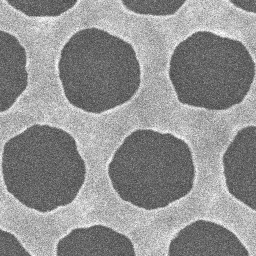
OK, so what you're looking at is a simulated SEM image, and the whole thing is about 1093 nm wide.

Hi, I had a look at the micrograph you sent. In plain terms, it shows holes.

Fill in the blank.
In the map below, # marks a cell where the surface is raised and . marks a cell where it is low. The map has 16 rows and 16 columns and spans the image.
#...####...####.
################
.###....####...#
..##.....##.....
..##.....##.....
..##.....##.....
.####...####...#
################
#...####...####.
.....##.....##..
.....##.....##..
.....##.....##..
#....###...####.
################
####...####...##
..##....###....#